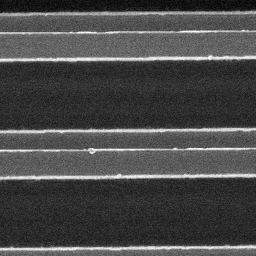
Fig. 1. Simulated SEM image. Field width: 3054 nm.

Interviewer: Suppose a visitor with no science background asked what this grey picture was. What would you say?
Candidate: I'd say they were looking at lines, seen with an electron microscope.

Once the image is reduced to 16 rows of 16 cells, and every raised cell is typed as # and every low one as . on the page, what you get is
................
################
################
################
................
................
................
................
################
################
################
................
................
................
................
...............#